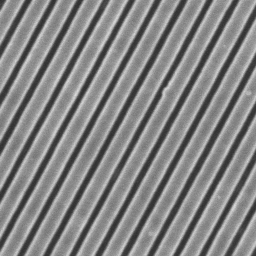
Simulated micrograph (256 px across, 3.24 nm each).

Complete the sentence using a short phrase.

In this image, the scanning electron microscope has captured parallel lines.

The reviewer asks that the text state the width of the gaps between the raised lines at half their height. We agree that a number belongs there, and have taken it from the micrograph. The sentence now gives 27.2 nm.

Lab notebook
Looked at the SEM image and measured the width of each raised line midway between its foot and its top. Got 48.2 nm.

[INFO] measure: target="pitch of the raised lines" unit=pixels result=22.9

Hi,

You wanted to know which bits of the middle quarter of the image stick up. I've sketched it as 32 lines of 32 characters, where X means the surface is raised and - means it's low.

---XXXX--XXXX---XXXX--XXXX---XXX
--XXXXX--XXXX--XXXX---XXXX--XXXX
--XXXX--XXXX---XXXX--XXXX---XXXX
-XXXX---XXXX--XXXX---XXXX--XXXX-
-XXXX--XXXX---XXXX--XXXX---XXXX-
XXXX---XXXX--XXXX---XXXX--XXXX--
XXXX--XXXX---XXXX--XXXX--XXXXX--
XXX---XXXX--XXXX--XXXXX--XXXX--X
XXX--XXXX---XXX---XXXX---XXXX--X
XX--XXXXX--XXXX--XXXX---XXXX--XX
XX--XXXX---XXXX--XXXX--XXXXX--XX
X--XXXX---XXXX--XXXX---XXXX--XXX
---XXXX--XXXXX--XXXX--XXXX---XXX
--XXXX---XXXX--XXXX---XXXX--XXXX
--XXXX--XXXX---XXXX--XXXX---XXXX
-XXXX---XXXX--XXXX---XXXX--XXXX-
-XXXX--XXXX---XXXX--XXXX---XXXX-
XXXX---XXXX--XXXX---XXXX--XXXX--
XXXX--XXXX---XXXX--XXXX---XXXX--
XXX---XXXX--XXXX---XXXX--XXXX---
XXX--XXXX--XXXXX--XXXX--XXXXX--X
XX---XXXX--XXXX---XXXX--XXXX--XX
XX--XXXX--XXXXX--XXXX--XXXX---XX
X---XXXX--XXXX--XXXXX--XXXX--XXX
---XXXX--XXXX---XXXX--XXXX---XXX
--XXXXX--XXXX--XXXX---XXXX--XXXX
--XXXX--XXXX---XXXX--XXXX---XXXX
-XXXX---XXXX--XXXX---XXXX--XXXX-
-XXXX--XXXX---XXXX--XXXX---XXXX-
XXXX---XXXX--XXXX---XXXX--XXXX--
XXXX--XXXX---XXXX--XXXX---XXXX--
XXX---XXXX--XXXX--XXXXX--XXXX---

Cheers